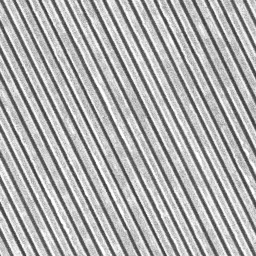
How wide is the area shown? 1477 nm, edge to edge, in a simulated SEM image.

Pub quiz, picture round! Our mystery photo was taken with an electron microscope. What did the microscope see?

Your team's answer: parallel lines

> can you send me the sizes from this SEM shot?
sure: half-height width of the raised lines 45.3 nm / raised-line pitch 66.3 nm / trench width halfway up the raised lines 22.7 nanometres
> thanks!